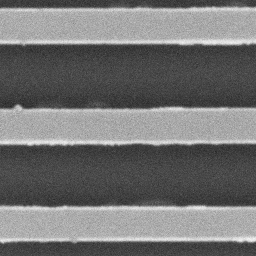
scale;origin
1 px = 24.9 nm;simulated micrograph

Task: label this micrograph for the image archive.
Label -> lines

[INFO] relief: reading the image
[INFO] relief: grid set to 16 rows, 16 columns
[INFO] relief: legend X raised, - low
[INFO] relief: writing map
----------------
XXXXXXXXXXXXXXXX
XXXXXXXXXXXXXXXX
----------------
----------------
----------------
----------------
XXXXXXXXXXXXXXXX
XXXXXXXXXXXXXXXX
----------------
----------------
----------------
----------------
XXXXXXXXXXXXXXXX
XXXXXXXXXXXXXXXX
----------------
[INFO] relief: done